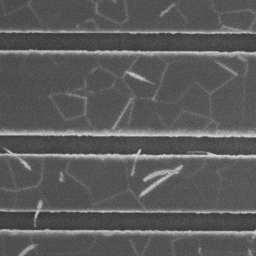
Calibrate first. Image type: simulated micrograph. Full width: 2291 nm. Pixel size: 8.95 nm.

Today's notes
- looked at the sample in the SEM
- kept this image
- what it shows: lines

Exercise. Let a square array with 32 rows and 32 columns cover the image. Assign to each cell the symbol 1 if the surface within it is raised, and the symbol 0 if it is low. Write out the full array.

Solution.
11111111111111111111111111111111
11111111111111111111111111111111
11111111111111111111111111111111
11111111111111111111111111111111
00000000000000000000000000000000
00000000000000000000000000000000
11111111111111111111111111110110
11111111111111111111111111111111
11111111111111111111111111111111
11111111111111111111111111111111
11111111111111111111111111111111
11111111111111111111111111111111
11111111111111111111111111111111
11111111111111111111111111111111
11111111111111111111111111111111
11111111111111111111111111111111
11111111111111111111111111111111
00000000000000000000000000000000
00000000000000000000000000000000
11111111111111111111111111111111
11111111111111111111111111111111
11111111111111111111111111111111
11111111111111111111111111111111
11111111111111111111111111111111
11111111111111111111111111111111
11111111111111111111111111111111
00001000000000000000000011111111
00000000000000000000000000000000
00000000000000000000000000000000
11111111111111111111111111111111
11111111111111111111111111111111
11111111111111111111111111111111